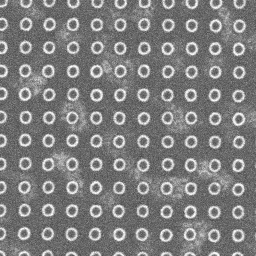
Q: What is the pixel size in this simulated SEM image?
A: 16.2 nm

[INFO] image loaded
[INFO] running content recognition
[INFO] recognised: a regular array of raised bodies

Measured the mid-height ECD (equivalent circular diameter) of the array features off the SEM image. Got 173 nanometres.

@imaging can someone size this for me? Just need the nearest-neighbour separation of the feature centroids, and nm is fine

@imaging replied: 372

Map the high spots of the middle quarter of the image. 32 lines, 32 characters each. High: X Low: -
--------------------------------
-XX----XX----XX----XX----XX----X
-XX----XX----XX----XX----XX----X
--------------------------------
--------------------------------
--------------------------------
--X-----------------------------
-XXX---XX----XX----XX----XX----X
-XX----XX----XX----XX----XX----X
--------------------------------
--------------------------------
--------------------------------
-XX----XX----XX----------XX----X
-XX----XX----XX----XX----XX----X
-XX----XX----XX----XX----XX----X
--------------------------------
--------------------------------
--------------------------------
-XX----XX----XX----XX----XX----X
-XX----XX----XX----XX----XX----X
-------------XX----XX----XX----X
--------------------------------
--------------------------------
--------------------------------
-XX----XX----XX----XX----XX----X
-XX----XX----XX----XX----XX----X
-------------------X-----------X
--------------------------------
--------------------------------
--------------------------------
-XX----XX----XX----XX----XX----X
-XX----XX----XX----XX----XX----X